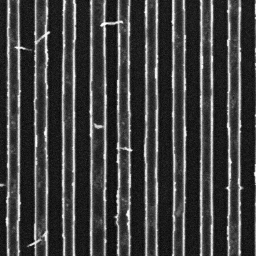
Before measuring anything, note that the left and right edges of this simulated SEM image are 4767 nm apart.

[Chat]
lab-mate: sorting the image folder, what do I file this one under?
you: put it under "parallel lines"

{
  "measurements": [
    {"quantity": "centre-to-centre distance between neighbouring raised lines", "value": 514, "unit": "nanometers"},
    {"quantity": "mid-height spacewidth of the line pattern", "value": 300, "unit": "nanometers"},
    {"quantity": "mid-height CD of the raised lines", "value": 219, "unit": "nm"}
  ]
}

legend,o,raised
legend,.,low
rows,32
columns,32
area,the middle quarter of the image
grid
oo.....ooo....oo....ooo....ooo..
ooo....ooo....oo....ooo....ooo..
ooo....ooo....oo....ooo....ooo..
ooo....ooo....oo....ooo....ooo..
ooo....ooo...ooo.....oo....ooo..
ooo....ooo...ooo.....oo....ooo..
oo.....ooo...ooo.....oo....ooo..
ooo....ooo...oooo....oo....ooo..
oo.....ooo....oo.....oo....ooo..
oo.....ooo...ooo.....oo....ooo..
oo.....ooo...ooo.....oo....ooo..
oo....oooo...ooo.....oo....ooo..
ooo...oooo...ooo....ooo....ooo..
ooo....ooo....oo....ooo....ooo..
oo.....ooo...ooo....ooo....ooo..
oo.....ooo....ooo....oo....ooo..
ooo....ooo....ooo....oo....oooo.
oo....oooo....oo.....oo....oooo.
oo.....ooo....oo....ooo....ooo..
oo.....ooo...ooo....ooo....ooo..
oo.....ooo...ooo....ooo....ooo..
oo.....ooo...oooo...ooo....ooo..
oo.....ooo...ooo....ooo....ooo..
oo.....ooo...ooo....ooo....ooo..
oo.....ooo...ooo....ooo....ooo..
oo.....ooo....ooo....oo....ooo..
oo.....ooo....oo....ooo....ooo..
oo.....ooo....ooo...ooo....ooo..
oo.....ooo....ooo...ooo....ooo..
oo.....ooo....ooo...ooo.....oo..
oo.....ooo....ooo....oo.....oo..
oo.....ooo...ooo.....oo.....oo..